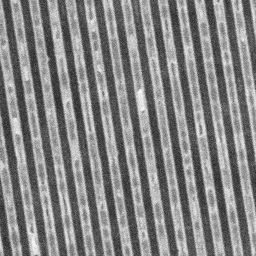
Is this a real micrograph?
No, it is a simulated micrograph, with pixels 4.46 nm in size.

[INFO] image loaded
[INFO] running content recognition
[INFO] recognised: parallel lines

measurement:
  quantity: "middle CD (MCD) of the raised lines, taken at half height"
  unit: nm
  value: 37.5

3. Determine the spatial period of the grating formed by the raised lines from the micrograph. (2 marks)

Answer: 81.3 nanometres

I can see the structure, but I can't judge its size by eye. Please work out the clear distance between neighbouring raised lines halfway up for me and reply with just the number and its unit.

41.4 nanometres